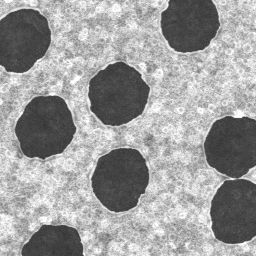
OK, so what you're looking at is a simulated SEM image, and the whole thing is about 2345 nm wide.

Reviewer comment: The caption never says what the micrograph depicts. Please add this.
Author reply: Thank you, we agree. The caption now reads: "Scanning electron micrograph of holes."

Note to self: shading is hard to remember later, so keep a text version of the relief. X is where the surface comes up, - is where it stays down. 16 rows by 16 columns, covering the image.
XXXXXXXXXX----XX
---XXXXXXX----XX
---XXXXXXX---XXX
---XXXXXXXXXXXXX
X-XXXX---XXXXXXX
XXXXXX---XXXXXXX
XX--XX---XXXXXXX
X----X--XXXXXX--
X----XXXXXXXX---
X---XXX--XXXX---
XXXXXX---XXXX---
XXXXXX---XXXXX--
XXXXXX---XXXX---
XXXXXXXXXXXXX---
XX---XXXXXXXX---
X----XXXXXXXXXXX